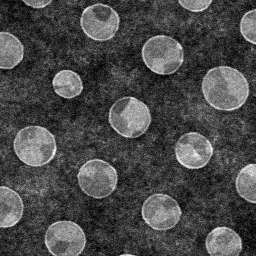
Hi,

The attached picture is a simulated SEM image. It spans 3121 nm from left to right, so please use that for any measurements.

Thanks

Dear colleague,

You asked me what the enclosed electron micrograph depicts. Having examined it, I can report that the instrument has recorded a regular array of raised bodies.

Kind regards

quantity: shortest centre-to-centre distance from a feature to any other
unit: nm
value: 849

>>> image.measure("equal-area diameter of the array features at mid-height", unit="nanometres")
463